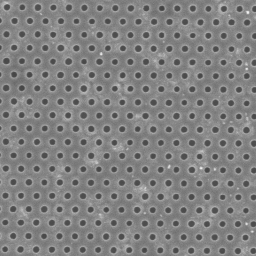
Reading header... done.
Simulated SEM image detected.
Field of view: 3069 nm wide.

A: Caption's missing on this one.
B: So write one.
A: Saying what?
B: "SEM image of a regular array of holes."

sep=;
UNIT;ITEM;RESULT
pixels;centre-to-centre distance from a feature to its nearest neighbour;15.1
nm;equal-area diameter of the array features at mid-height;77.7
